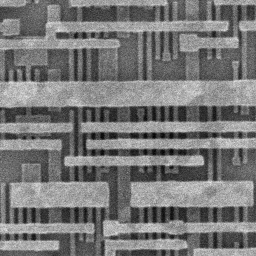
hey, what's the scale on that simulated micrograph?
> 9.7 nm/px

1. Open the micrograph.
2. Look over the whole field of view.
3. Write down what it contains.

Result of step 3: wiring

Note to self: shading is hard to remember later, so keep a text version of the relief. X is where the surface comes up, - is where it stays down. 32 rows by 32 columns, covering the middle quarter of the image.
--------------------------------
--------------------------------
--------------------------------
--------------------------------
---------XXX-----XXXXXXXXXXXXXXX
XXXXXXXXXXXXXXXXXXXXXXXXXXXXXXXX
XXXXXXXXXXXXXXXXXXXXXXXXXXXXXXXX
XXXXXXXXXXXXXXXXXXXXXXXXXXXXXXXX
XXXXXXXXXXXXXXXXXXXXXXXXXXXXXXXX
XXXXXXXXXXXXXXXXXXXXXXXXXXXXXXXX
X--XX-XXXXXXXXX-----------------
--------------------------------
--------------------------------
--------------------------------
---------------------XX---------
XX--XXXXXXXXXXXXXXXXXXXXXXXXXXXX
XX--XXXXXXXXXXXXXXXXXXXXXXXXXXXX
--------------------------------
--------------------------------
------XXXXXXXXXXXXXXXXXXXXXXXXXX
------XXXXXXXXXXXXXXXXXXXXXXXXXX
--------------------------------
--------------------------------
-XXXXXXXXXXXXXXXXXXXXXXXXXXXXXXX
XXXXXXXXXXXXXXXXXXXXXXXXXXXXXXXX
--------------------------------
--------------------------------
--------------------------------
--------------------------------
-------------------------XXX----
XXXXXXXXXXX------XXXXXXXXXXXXXXX
XXXXXXXXXXX------XXXXXXXXXXXXXXX